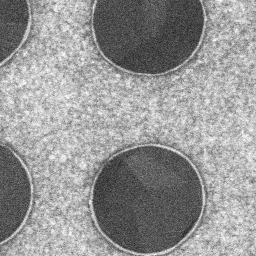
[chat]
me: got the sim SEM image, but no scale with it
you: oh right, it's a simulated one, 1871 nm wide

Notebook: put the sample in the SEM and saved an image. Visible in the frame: raised bodies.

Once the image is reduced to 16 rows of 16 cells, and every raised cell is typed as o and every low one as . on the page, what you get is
oo....ooooooo...
oo....ooooooo...
o.....ooooooo...
o......ooooo....
........oo......
................
................
................
................
o.......ooo.....
oo....oooooo....
oo....ooooooo...
oo....ooooooo...
oo....ooooooo...
o.....oooooo....
........ooo.....